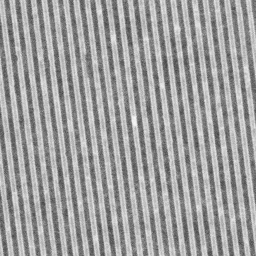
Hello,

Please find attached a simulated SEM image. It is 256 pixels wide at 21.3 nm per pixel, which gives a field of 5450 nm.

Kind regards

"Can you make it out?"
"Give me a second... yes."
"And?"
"parallel lines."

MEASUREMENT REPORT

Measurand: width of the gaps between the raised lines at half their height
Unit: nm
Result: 140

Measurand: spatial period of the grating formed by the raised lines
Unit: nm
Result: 227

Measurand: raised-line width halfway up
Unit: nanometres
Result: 84.5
